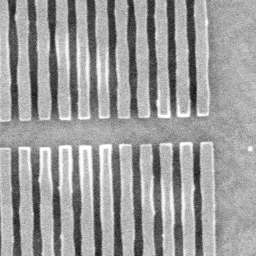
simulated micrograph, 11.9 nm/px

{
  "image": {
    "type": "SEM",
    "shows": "groups of lines, slits or small figures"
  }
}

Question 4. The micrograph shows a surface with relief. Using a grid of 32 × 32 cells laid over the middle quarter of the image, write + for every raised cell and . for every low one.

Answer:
+...++...++..+++..+++...++..+++.
+...++...++..+++..+++...++..+++.
+...++...++..+++...++...++..+++.
+...++...++...++...++...++..+++.
+...++...++...++...++...++..+++.
+...++...++...++...++...++..+++.
+...++...++...++..+++...++..+++.
+...++...++...++..+++...++..+++.
+...++...++...++..+++...++..+++.
+...++...++...++...++...++..+++.
+...++...++...++...++...++..+++.
+...++...++...++...++...++..+++.
+...++...++...++...++...++...++.
+...+...........................
................................
................................
................................
................................
................................
................................
..............+++..+++..+++..+++
+...++...++...+++..+++..+++..+++
+...++...++...+++..+++..+++..+++
++..++...++...+++..+++..+++..+++
++..+++..++...+++..+++..+++..+++
++..+++..++...+++..+++..+++..+++
++..+++..++...+++..+++..+++..+++
++..+++..+++..+++..+++..+++..+++
++..+++..+++...++...++..+++..+++
++..+++..+++...++...++..+++...++
++..+++..+++...++...++...++...++
++...++..+++...++...++...++...++